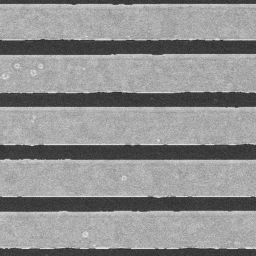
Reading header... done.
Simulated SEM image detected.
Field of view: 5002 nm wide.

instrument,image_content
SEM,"lines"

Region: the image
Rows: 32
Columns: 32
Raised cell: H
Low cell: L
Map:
LLLLLLLLLLLLLLLLLLLLLLLLLLLLLLLL
HHHHHHHHHHHHHHHHHHHHHHHHHHHHHHHH
HHHHHHHHHHHHHHHHHHHHHHHHHHHHHHHH
HHHHHHHHHHHHHHHHHHHHHHHHHHHHHHHH
HHHHHHHHHHHHHHHHHHHHHHHHHHHHHHHH
LLLLLLLLLLLLLLLLLLLLLLLLLLLLLLLL
LLLLLLLLLLLLLLLLLLLLLLLLLLLLLLLL
HHHHHHHHHHHHHHHHHHHHHHHHHHHHHHHH
HHHHHHHHHHHHHHHHHHHHHHHHHHHHHHHH
HHHHHHHHHHHHHHHHHHHHHHHHHHHHHHHH
HHHHHHHHHHHHHHHHHHHHHHHHHHHHHHHH
LLLLLLLLLLLLLLLLLLLLLLLLLLLLLLLL
LLLLLLLLLLLLLLLLLLLLLLLLLLLLLLLL
LLLLLLLLLLLLLLLLLLLLLLLLLLLLLLLL
HHHHHHHHHHHHHHHHHHHHHHHHHHHHHHHH
HHHHHHHHHHHHHHHHHHHHHHHHHHHHHHHH
HHHHHHHHHHHHHHHHHHHHHHHHHHHHHHHH
HHHHHHHHHHHHHHHHHHHHHHHHHHHHHHHH
LLLLLLLLLLLLLLLLLLLLLLLLLLLLLLLL
LLLLLLLLLLLLLLLLLLLLLLLLLLLLLLLL
HHHHHHHHHHHHHHHHHHHHHHHHHHHHHHHH
HHHHHHHHHHHHHHHHHHHHHHHHHHHHHHHH
HHHHHHHHHHHHHHHHHHHHHHHHHHHHHHHH
HHHHHHHHHHHHHHHHHHHHHHHHHHHHHHHH
LLLLLLLLLLLLLLLLLLLHHLLLLLLLLLLL
LLLLLLLLLLLLLLLLLLLLLLLLLLLLLLLL
LLLLLLLLLLLLLLLLLLLLLLLLLLLLLLLL
HHHHHHHHHHHHHHHHHHHHHHHHHHHHHHHH
HHHHHHHHHHHHHHHHHHHHHHHHHHHHHHHH
HHHHHHHHHHHHHHHHHHHHHHHHHHHHHHHH
HHHHHHHHHHHHHHHHHHHHHHHHHHHHHHHH
LLLLLLLLLLLLLLLLLLLLLLLLLLLLLLLL